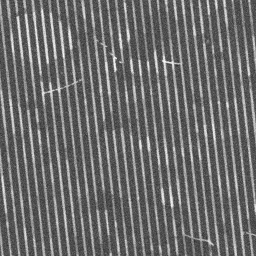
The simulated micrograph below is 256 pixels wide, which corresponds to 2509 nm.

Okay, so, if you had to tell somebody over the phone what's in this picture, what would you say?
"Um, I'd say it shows parallel lines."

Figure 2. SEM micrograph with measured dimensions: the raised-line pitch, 8.29 pixels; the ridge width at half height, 0.0134 microns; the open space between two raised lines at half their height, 0.0682 microns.